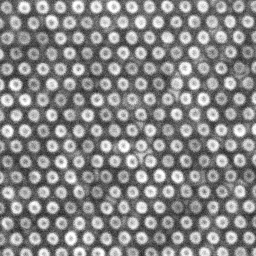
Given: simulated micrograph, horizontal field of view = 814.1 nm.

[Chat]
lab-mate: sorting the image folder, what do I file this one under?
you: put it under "a regular array of raised bodies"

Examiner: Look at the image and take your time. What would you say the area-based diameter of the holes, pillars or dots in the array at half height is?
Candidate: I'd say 32.6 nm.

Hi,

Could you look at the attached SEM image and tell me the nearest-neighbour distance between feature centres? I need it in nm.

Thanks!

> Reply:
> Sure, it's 55.4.